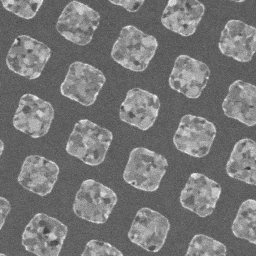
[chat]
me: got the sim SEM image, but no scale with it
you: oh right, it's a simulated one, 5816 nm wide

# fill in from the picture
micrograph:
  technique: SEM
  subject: a regular array of raised bodies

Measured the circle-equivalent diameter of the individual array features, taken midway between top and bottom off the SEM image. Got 908 nm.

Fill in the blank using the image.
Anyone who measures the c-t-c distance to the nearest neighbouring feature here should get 59.3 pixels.